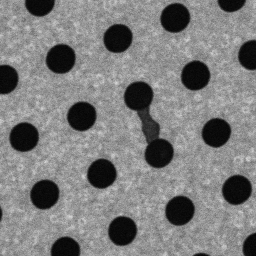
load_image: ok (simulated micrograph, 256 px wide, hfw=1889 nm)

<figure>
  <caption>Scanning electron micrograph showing a regular array of holes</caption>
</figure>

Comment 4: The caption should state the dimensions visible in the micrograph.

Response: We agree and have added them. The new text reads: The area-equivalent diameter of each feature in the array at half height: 217 nanometers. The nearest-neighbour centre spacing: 448 nanometers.